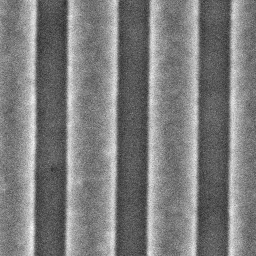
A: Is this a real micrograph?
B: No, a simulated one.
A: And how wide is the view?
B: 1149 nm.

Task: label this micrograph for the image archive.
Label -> wiring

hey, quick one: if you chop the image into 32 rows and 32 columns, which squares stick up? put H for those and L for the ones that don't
HHHHLLLLLHHHHHHLLLLHHHHHHLLLLHHH
HHHHLLLLLHHHHHHLLLLHHHHHHLLLLHHH
HHHHLLLLLHHHHHHLLLLHHHHHHLLLLHHH
HHHHLLLLLHHHHHHLLLLHHHHHHLLLLHHH
HHHHLLLLLHHHHHHLLLLHHHHHHLLLLHHH
HHHHLLLLLHHHHHHLLLLHHHHHHLLLLHHH
HHHHLLLLLHHHHHHLLLLHHHHHHLLLLHHH
HHHHLLLLLHHHHHHLLLLHHHHHHLLLLHHH
HHHHLLLLLHHHHHHLLLLHHHHHHLLLLHHH
HHHHLLLLLHHHHHHLLLLHHHHHHLLLLHHH
HHHHLLLLLHHHHHHLLLLHHHHHHLLLLHHH
HHHHLLLLLHHHHHLLLLLHHHHHHLLLLHHH
HHHHLLLLLHHHHHLLLLLHHHHHHLLLLHHH
HHHHLLLLLHHHHHLLLLLHHHHHHLLLLHHH
HHHHLLLLLHHHHHLLLLLHHHHHHLLLLHHH
HHHHLLLLLHHHHHLLLLLHHHHHHLLLLHHH
HHHHLLLLLHHHHHLLLLLHHHHHHLLLLHHH
HHHHLLLLHHHHHHLLLLLHHHHHHLLLLHHH
HHHHLLLLLHHHHHLLLLLHHHHHHLLLLHHH
HHHHLLLLLHHHHHLLLLLHHHHHHLLLLHHH
HHHHLLLLLHHHHHLLLLLHHHHHHLLLLHHH
HHHHLLLLLHHHHHLLLLLHHHHHHLLLLHHH
HHHHLLLLLHHHHHLLLLLHHHHHHLLLLHHH
HHHHLLLLHHHHHHLLLLLHHHHHHLLLLHHH
HHHHLLLLHHHHHHLLLLLHHHHHHLLLLHHH
HHHHLLLLHHHHHHLLLLLHHHHHHLLLLHHH
HHHHLLLLHHHHHHLLLLLHHHHHLLLLLHHH
HHHHLLLLHHHHHHLLLLLHHHHHLLLLLHHH
HHHHLLLLHHHHHHLLLLLHHHHHLLLLLHHH
HHHHLLLLHHHHHHLLLLLHHHHHLLLLLHHH
HHHHLLLLHHHHHHLLLLLHHHHHLLLLLHHH
HHHHLLLLHHHHHHLLLLLHHHHHLLLLLHHH